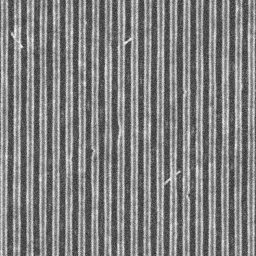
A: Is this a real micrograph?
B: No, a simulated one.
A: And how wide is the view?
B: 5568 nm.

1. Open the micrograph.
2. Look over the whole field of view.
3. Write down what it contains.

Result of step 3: parallel lines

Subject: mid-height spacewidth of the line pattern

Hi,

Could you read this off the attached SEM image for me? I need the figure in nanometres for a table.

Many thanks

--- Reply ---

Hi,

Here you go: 166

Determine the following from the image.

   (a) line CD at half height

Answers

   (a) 112 nanometres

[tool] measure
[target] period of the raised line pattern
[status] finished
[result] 0.283 micrometres